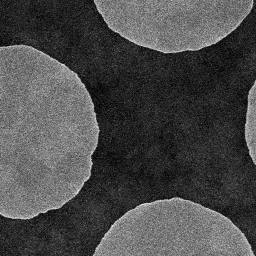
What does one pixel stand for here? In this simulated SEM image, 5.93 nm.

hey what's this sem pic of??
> raised bodies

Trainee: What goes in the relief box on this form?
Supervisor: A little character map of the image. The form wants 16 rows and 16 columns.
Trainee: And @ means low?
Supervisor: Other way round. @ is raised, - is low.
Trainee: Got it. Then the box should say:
------@@@@@@@@@@
-------@@@@@@@@-
--------@@@@@@--
@@@-------------
@@@@@-----------
@@@@@-----------
@@@@@@---------@
@@@@@@---------@
@@@@@@---------@
@@@@@@----------
@@@@@@----------
@@@@@-----------
@@@@------@@----
@@------@@@@@@--
-------@@@@@@@@-
------@@@@@@@@@@